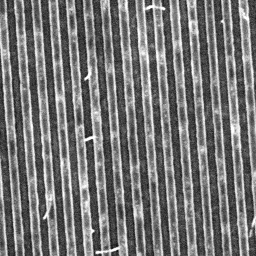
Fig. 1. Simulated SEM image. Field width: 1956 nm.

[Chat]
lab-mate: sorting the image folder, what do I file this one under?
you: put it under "parallel lines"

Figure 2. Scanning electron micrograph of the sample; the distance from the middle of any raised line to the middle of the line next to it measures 132 nm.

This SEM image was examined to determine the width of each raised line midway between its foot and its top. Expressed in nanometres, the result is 66.6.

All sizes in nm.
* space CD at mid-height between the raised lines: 66.6